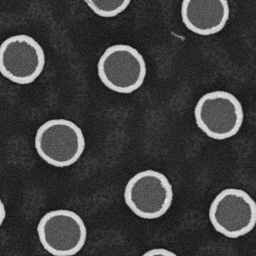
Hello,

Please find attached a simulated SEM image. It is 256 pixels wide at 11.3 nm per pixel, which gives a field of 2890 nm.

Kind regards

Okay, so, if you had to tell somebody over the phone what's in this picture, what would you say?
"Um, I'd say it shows raised bodies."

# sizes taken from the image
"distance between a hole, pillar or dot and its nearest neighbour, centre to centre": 1020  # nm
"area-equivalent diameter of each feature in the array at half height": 485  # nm